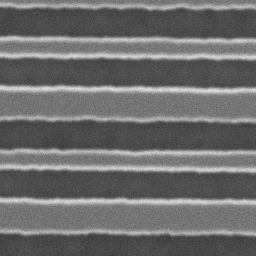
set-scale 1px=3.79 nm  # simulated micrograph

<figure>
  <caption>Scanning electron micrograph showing lines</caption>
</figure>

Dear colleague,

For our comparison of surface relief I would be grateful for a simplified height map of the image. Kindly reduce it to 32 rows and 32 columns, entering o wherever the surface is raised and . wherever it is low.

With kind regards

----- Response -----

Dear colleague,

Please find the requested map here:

oooooooooooooooooooooooooooooooo
................................
................................
................................
................................
oooooooooooooooooooooooooooooooo
oooooooooooooooooooooooooooooooo
................................
................................
................................
................................
oooooooooooooooooooooooooooooooo
oooooooooooooooooooooooooooooooo
oooooooooooooooooooooooooooooooo
oooooooooooooooooooooooooooooooo
................................
................................
................................
................................
oooooooooooooooooooooooooooooooo
oooooooooooooooooooooooooooooooo
................................
................................
................................
................................
oooooooooooooooooooooooooooooooo
oooooooooooooooooooooooooooooooo
oooooooooooooooooooooooooooooooo
oooooooooooooooooooooooooooooooo
................................
................................
................................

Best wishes